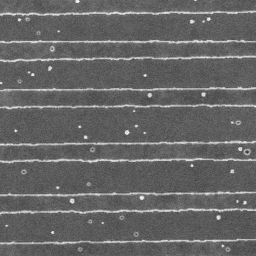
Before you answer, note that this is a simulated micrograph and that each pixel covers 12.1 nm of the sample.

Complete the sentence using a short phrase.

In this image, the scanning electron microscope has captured lines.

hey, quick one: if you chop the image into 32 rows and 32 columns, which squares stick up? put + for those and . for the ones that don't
++++++++++++++++++++++++++++++++
+++++++++++++++++++++++++++++++.
................................
................................
................................
++++++++++++++++++++++++++++++++
++++++++++++++++++++++++++++++++
++++++..........................
................................
................................
................................
++++++++++++++++++++++++++++++++
++++++++++++++++++++++++++++++++
.+..............................
................................
................................
................................
................................
++++++++++++++++++++++++++++++++
++++++++++++++++++++++++++++++++
................................
................................
................................
................................
++++++++++++++++++++++++++++++++
++++++++++++++++++++++++++++++++
++.++.....+.....................
................................
................................
................................
++++++++++++++++++++++++++++++++
++++++++++++++++++++++++++++++++